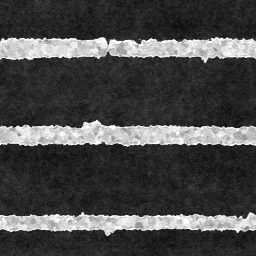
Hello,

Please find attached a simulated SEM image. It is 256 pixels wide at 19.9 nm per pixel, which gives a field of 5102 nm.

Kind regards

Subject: one or a few lines or trenches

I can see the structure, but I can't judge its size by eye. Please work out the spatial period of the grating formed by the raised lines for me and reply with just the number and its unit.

1740 nm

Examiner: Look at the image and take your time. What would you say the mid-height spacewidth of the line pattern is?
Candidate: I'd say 1410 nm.